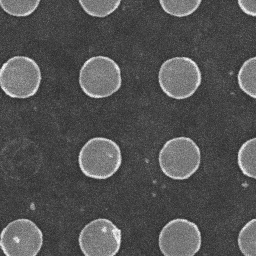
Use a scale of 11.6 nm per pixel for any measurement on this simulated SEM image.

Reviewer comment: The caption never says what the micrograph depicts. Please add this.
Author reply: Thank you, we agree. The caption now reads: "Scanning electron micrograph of raised bodies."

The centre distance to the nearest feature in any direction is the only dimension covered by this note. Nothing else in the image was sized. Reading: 924 nm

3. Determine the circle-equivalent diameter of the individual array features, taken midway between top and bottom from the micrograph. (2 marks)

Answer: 472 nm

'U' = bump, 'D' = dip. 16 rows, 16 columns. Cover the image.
UUDDDUUDDDUUDDDU
DDDDDDDDDDDDDDDD
DDDDDDDDDDDDDDDD
DDDDDDDDDDDDDDDD
UUDDDUUDDDUUDDDU
UUDDDUUDDDUUDDDU
DDDDDDDDDDDDDDDD
DDDDDDDDDDDDDDDD
DDDDDDDDDDDDDDDD
DDDDDUUDDDUUDDDU
DDDDDUUDDDUUDDDU
DDDDDDDDDDDDDDDD
DDDDDDDDDDDDDDDD
DDDDDDDDDDDDDDDD
UUDDDUUDDDUUDDDU
UUDDDUUDDDUUDDDU